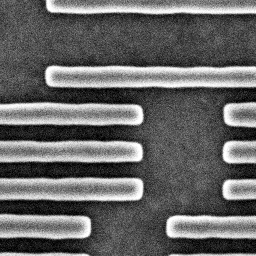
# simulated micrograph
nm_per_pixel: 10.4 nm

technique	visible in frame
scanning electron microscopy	wiring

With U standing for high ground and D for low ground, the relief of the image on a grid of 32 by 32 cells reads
DDDDDDUUUUUUUUUUUUUUUUUUUUUUUUUU
DDDDDDDDUUUUUUDDDUUUUUUUUUUUUUUU
DDDDDDDDDDDDDDDDDDDDDDDDDDDDDDDD
DDDDDDDDDDDDDDDDDDDDDDDDDDDDDDDD
DDDDDDDDDDDDDDDDDDDDDDDDDDDDDDDD
DDDDDDDDDDDDDDDDDDDDDDDDDDDDDDDD
DDDDDDDDDDDDDDDDDDDDDDDDDDDDDDDD
DDDDDDDDDDDDDDDDDDDDDDDDDDDDDDDD
DDDDDDUUUUUUUUUUUUUUUUDDUUUDUUUU
DDDDDDUUUUUUUUUUUUUUUUUUUUUUUUUU
DDDDDDUUUUUUUUUUUUUUUUUUUUUUUUUU
DDDDDDDDDDDDDDDDDDDDDDDDDDDDDDDD
DDDDDDDDDDDDDDDDDDDDDDDDDDDDDDDD
UUUUUUUUUUUUUUUUUDDDDDDDDDDDUUUU
UUUUUUUUUUUUUUUUUUDDDDDDDDDDUUUU
DUUUDDUUUDUUUUDDUDDDDDDDDDDDDUUU
DDDDDDDDDDDDDDDDDDDDDDDDDDDDDDDD
DDDDDDDDDDDDDDDDDDDDDDDDDDDDDDDD
UUUUUUUUUUUUUUUUUUDDDDDDDDDDUUUU
UUUUUUUUUUUUUUUUUUDDDDDDDDDDUUUU
DDDDDDDDDDDDDDDDDDDDDDDDDDDDDDDD
DDDDDDDDDDDDDDDDDDDDDDDDDDDDDDDD
UUUUUUUUUUUUUUUUUDDDDDDDDDDDDDDD
UUUUUUUUUUUUUUUUUUDDDDDDDDDDUUUU
UUUUUUUUUUUUUUUUUUDDDDDDDDDDUUUU
DDDDDDDDDDDDDDDDDDDDDDDDDDDDDDDD
DDDDDDDDDDDDDDDDDDDDDDDDDDDDDDDD
UUUUUUUUUUUDDDDDDDDDDUUUUUUUUUUU
UUUUUUUUUUUDDDDDDDDDDUUUUUUUUUUU
UUUUUUUUUUUDDDDDDDDDDUUUUUUUUUUU
DDDDDDDDDDDDDDDDDDDDDDDDDDDDDDDD
DDDDDDDDDDDDDDDDDDDDDDDDDDDDDDDD